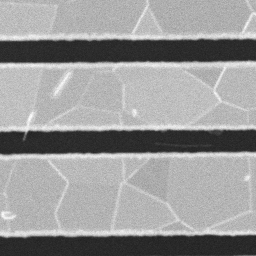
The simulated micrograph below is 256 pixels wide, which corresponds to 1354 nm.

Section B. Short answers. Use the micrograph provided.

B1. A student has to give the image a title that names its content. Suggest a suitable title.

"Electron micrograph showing lines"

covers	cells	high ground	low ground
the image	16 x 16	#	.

################
################
##..............
................
################
################
################
################
................
................
################
################
################
################
################
................